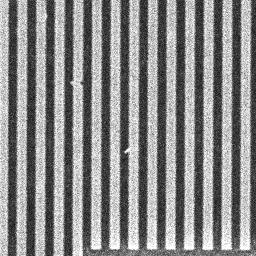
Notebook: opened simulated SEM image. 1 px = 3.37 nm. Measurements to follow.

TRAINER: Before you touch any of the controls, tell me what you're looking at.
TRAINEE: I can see parallel lines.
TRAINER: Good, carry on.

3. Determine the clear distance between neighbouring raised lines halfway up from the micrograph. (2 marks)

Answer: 33.3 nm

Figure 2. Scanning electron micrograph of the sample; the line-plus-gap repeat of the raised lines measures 62.7 nanometers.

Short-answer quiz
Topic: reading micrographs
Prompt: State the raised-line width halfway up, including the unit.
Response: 0.0303 micrometres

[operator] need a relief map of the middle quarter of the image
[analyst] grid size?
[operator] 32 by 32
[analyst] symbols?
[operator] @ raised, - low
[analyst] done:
---@@--@@---@@--@@---@@---@@---@
---@@--@@---@@--@@@--@@---@@---@
---@@--@@---@@--@@@--@@---@@---@
---@@--@@---@@--@@---@@---@@---@
--@@---@@---@@--@@---@@---@@---@
--@@---@@---@@--@@---@@---@@--@@
--@@---@@---@@--@@---@@---@@--@@
--@@---@@---@@--@@---@@---@@--@@
--@@---@@---@@--@@---@@---@@---@
--@@---@@---@@--@@---@@---@@---@
--@@---@@---@@--@@@--@@---@@---@
--@@---@@---@@--@@@--@@---@@--@@
--@@---@@---@@--@@@--@@---@@--@@
--@@---@@---@@--@@@--@@---@@--@@
--@@---@@---@@--@@@--@@---@@---@
--@@---@@---@@--@@@--@@---@@---@
--@@---@@---@@--@@@--@@---@@---@
--@@---@@---@@--@@@--@@---@@---@
--@@---@@---@@--@@@--@@---@@---@
--@@---@@---@@--@@---@@---@@---@
--@@---@@---@@--@@@--@@---@@---@
--@@---@@---@@--@@@--@@---@@--@@
--@@---@@---@@--@@@--@@---@@--@@
--@@---@@---@@--@@@--@@---@@--@@
--@@---@@---@@--@@@--@@---@@--@@
--@@---@@---@@--@@@--@@---@@--@@
--@@---@@---@@--@@@--@@---@@--@@
--@@---@@---@@--@@@--@@---@@--@@
--@@---@@---@@--@@@--@@---@@--@@
--@@---@@---@@--@@@--@@---@@--@@
--@@---@@---@@--@@---@@---@@--@@
--@@---@@---@@--@@---@@---@@--@@